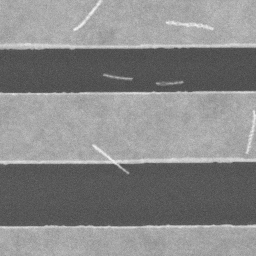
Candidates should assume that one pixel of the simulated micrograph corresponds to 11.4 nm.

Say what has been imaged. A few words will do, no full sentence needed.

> lines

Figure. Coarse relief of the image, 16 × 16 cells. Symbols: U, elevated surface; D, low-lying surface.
UUUUUUUUUUUUUUUU
UUUUUUUUUUUUUUUU
UUUUUUUUUUUUUUUU
DDDDDDDDDDDDDDDD
DDDDDDDDDDDDDDDD
DDDDDDDDDDDDDDDD
UUUUUUUUUUUUUUUU
UUUUUUUUUUUUUUUU
UUUUUUUUUUUUUUUU
UUUUUUUUUUUUUUUU
DDDDDDDDDDDDDDDD
DDDDDDDDDDDDDDDD
DDDDDDDDDDDDDDDD
DDDDDDDDDDDDDDDD
UUUUUUUUUUUUUUUU
UUUUUUUUUUUUUUUU